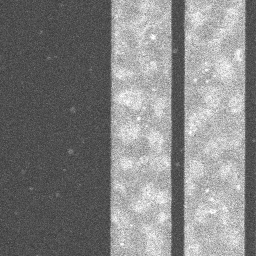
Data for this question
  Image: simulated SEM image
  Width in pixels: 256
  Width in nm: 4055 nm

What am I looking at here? one or a few lines or trenches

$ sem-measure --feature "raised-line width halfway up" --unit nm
245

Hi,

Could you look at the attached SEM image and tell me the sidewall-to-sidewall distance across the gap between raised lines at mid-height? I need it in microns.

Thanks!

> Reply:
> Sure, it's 0.917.